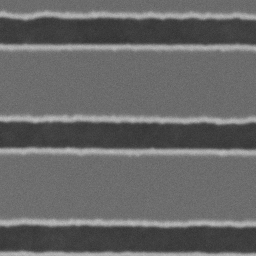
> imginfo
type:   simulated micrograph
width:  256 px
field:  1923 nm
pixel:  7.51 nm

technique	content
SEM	lines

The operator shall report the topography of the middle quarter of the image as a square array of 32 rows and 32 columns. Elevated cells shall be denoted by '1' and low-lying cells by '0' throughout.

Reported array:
11111111111111111111111111111111
11111111111111111111111111111111
11111111111111111111111111111111
11111111111111111111111111111111
11111111111111111111111111111111
11111111111111111111111111111111
11111111111111111111111111111111
11111111111111111111111111111111
11111111111111111111111111111111
11111111111111111111111111111111
11111111111111111111111111111111
11111111111111111111111111111111
11111111111111111111111111111111
11111111111111111111111111111111
00000000000000000000000110001111
00000000000000000000000000000000
00000000000000000000000000000000
00000000000000000000000000000000
00000000000000000000000000000000
00000000000000000000000000000000
00000000000000000000000000000000
11111111111111100001111110011111
11111111111111111111111111111111
11111111111111111111111111111111
11111111111111111111111111111111
11111111111111111111111111111111
11111111111111111111111111111111
11111111111111111111111111111111
11111111111111111111111111111111
11111111111111111111111111111111
11111111111111111111111111111111
11111111111111111111111111111111